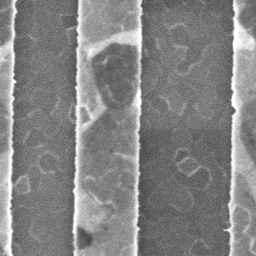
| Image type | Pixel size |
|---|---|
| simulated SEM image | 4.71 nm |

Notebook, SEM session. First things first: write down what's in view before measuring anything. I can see one or a few lines or trenches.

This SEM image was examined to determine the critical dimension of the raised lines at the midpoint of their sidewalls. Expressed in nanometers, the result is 255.